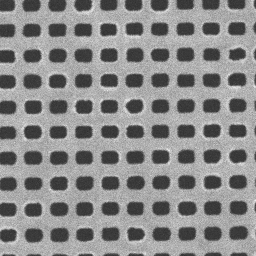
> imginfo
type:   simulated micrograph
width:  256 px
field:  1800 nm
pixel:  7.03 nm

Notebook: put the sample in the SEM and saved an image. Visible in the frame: a regular array of holes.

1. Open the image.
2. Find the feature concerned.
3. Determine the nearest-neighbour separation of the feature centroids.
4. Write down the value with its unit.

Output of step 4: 178 nm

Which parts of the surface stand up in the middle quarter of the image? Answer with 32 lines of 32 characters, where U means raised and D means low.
UUUUUUUUUUUUUUUUUUUUUUUUUUUUUUUU
UUUUUUUUUUUUUUUUUUUUUUUUUUUUUUUU
UUUUDDUUUUDDDUUUDDDUUUDDDDUUUDDD
DUUDDDDUUDDDDUUDDDDDUUDDDDUUDDDD
DUUDDDDUUDDDDDUDDDDDUUDDDDUUDDDD
UUUDDDDUUUDDDUUUDDDUUUDDDDUUDDDD
UUUUUUUUUUUUUUUUUUUUUUUUUUUUUUUU
UUUUUUUUUUUUUUUUUUUUUUUUUUUUUUUU
UUUUUUUUUUUUUUUUUUUUUUUUUUUUUUUU
DUUDDDDUUDDDDUUUDDDDUUDDDDUUDDDD
DUUDDDDUUDDDDDUDDDDDUUDDDDUUDDDD
DUUDDDDUUDDDDUUUDDDDUUDDDDUUDDDD
UUUUDDUUUUDDUUUUUDUUUUUUUUUUUUUU
UUUUUUUUUUUUUUUUUUUUUUUUUUUUUUUU
UUUUUUUUUUUUUUUUUUUUUUUUUUUUUUUU
UUUDDDDUUUDDDUUUDDDDUUDDDDUUUDDD
DUUDDDDUUDDDDDUUDDDDUUDDDDUUDDDD
DUUDDDDUUDDDDDUUDDDDUUDDDDUUDDDD
UUUDDDDUUUDDDUUUDDDUUUUDDDUUUDDD
UUUUUUUUUUUUUUUUUUUUUUUUUUUUUUUU
UUUUUUUUUUUUUUUUUUUUUUUUUUUUUUUU
UUUUDUUUUUUUUUUUUUUUUUUDDUUUUDDD
DUUDDDDUUDDDDDUUDDDDUUDDDDDUDDDD
DUUDDDDUUDDDDDUUDDDDUUDDDDDUDDDD
DUUDDDDUUDDDDDUUDDDDUUDDDDUUUDDD
UUUUUUUUUUUUUUUUUUUUUUUUUUUUUUUU
UUUUUUUUUUUUUUUUUUUUUUUUUUUUUUUU
UUUUUUUUUUUUUUUUUUUUUUUUUUUUUUUU
DUUDDDDUUUDDDDUUDDDDUUDDDDUUUDDD
DUUDDDDUUDDDDDUDDDDDUUDDDDDUUDDD
DUUDDDDUUDDDDDUUDDDDUUDDDDUUUDDD
DUUUDDUUUUDDDUUUUUDUUUUDDUUUUUDD